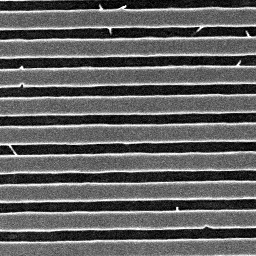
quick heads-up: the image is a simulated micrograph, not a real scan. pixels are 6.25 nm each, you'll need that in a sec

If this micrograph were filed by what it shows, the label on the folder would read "parallel lines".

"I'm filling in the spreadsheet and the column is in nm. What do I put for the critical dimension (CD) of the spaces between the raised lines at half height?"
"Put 67.9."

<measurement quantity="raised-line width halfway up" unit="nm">113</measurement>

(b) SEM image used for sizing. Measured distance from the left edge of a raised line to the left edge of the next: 0.18 micrometres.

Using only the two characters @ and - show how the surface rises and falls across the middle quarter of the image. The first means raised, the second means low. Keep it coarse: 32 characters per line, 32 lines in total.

--------------------------------
@@@@@@@@@@@@@@@@@@@@@@@@@@@@@@@@
@@@@@@@@@@@@@@@@@@@@@@@@@@@@@@@@
@@@@@@@@@@@@@@@@@@@@@@@@@@@@@@@@
@@@@@@@@@@@@@@@@@@@@@@@@@@@@@@@@
@@@@@@--------------------------
--------------------------------
--------------------------------
@@@@@@@@@@@@@@@@@@@@@@@@@@@@@@@@
@@@@@@@@@@@@@@@@@@@@@@@@@@@@@@@@
@@@@@@@@@@@@@@@@@@@@@@@@@@@@@@@@
@@@@@@@@@@@@@@@@@@@@@@@@@@@@@@@@
@@@@@@@@@----@@@@-@@@@@@--------
--------------------------------
--------------------------------
---@@@@@@@@@@@@@@@@@@@@@@@@@@@@@
@@@@@@@@@@@@@@@@@@@@@@@@@@@@@@@@
@@@@@@@@@@@@@@@@@@@@@@@@@@@@@@@@
@@@@@@@@@@@@@@@@@@@@@@@@@@@@@@@@
@@@@@@@@@@@@@@@@@@@@@@@@@@@-----
--------------------------------
--------------------------------
----------@@--@@@@@@@---@@@@@@@@
@@@@@@@@@@@@@@@@@@@@@@@@@@@@@@@@
@@@@@@@@@@@@@@@@@@@@@@@@@@@@@@@@
@@@@@@@@@@@@@@@@@@@@@@@@@@@@@@@@
@@@@@@@@@@@@@@@@@@@@@@@@@@@@@@@@
--------------------------------
--------------------------------
---------------------------@@@@@
@@@@@@@@@@@@@@@@@@@@@@@@@@@@@@@@
@@@@@@@@@@@@@@@@@@@@@@@@@@@@@@@@